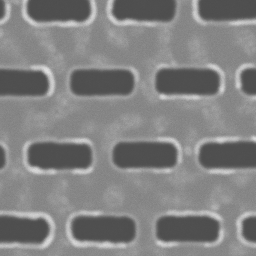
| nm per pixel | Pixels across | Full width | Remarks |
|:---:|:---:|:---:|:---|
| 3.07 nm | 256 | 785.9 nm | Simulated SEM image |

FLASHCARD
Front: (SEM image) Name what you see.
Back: holes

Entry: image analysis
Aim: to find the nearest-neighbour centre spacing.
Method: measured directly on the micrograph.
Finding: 0.26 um